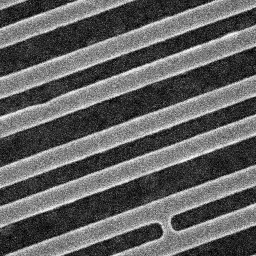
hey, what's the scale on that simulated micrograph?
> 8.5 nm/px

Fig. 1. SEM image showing parallel lines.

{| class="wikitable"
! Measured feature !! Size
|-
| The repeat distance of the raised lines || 41.9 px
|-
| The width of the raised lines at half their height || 0.163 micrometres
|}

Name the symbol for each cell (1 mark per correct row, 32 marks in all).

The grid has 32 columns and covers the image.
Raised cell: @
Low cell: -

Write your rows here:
@@----@-@@@@@@@-----------@@@@@@
------@@@@@@@----------@@@@@@@--
---@@@@@@@----------@@@@@@@-----
@@@@@@@-----------@@@@@@@-----@@
@@@@----------@@@@@@@@------@@@@
@@---------@@@@@@@@------@@@@@@@
---@-----@@@@@@@-------@@@@@@@--
------@@@@@@@@------@@@@@@@-----
----@@@@@@@------@@@@@@@---@----
-@@@@@@@------@@@@@@@@----------
@@@@@-@-----@@@@@@@----------@@@
@@----@--@@@@@@@----------@@@@@@
------@@@@@@@-----@@---@@@@@@@--
---@@@@@@@---@@------@@@@@@@----
-@@@@@@@-----@@---@@@@@@@------@
@@@@@----------@@@@@@@-------@@@
@@----------@@@@@@@-------@@@@@@
----------@@@@@@@-----@@@@@@@@--
-------@@@@@@@------@@@@@@@@----
----@@@@@@@-------@@@@@@@-------
-@@@@@@@-------@@@@@@@----------
@@@@@@------@@@@@@@------@----@@
@@@------@@@@@@@--@--------@@@@@
------@@@@@@@@----------@@@@@@@-
----@@@@@@@----------@@@@@@@----
-@@@@@@@----------@@@@@@@@------
@@@@@-----------@@@@@@@------@@@
@@@----------@@@@@@@@-----@@@@@@
@---------@@@@@@@---@@--@@@@@@@-
-------@@@@@@@------@@@@@@@@----
-----@@@@@@@------@@@@@@@@------
--@@@@@@@------@@@@@@@@---------